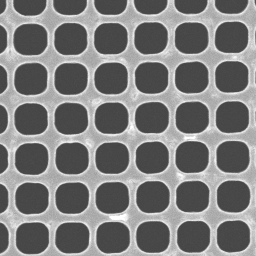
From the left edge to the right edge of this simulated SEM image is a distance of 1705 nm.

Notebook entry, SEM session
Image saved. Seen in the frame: a regular array of holes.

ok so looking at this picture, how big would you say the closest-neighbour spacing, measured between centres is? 39.6 px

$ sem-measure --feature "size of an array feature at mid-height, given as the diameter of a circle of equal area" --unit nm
228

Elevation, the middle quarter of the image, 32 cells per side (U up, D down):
DDDDDUUUUDDDDDDUUUUDDDDDDUUUUDDD
DDDDDDUUDDDDDDDDUUDDDDDDDDUUDDDD
DDDDDDUUDDDDDDDDUUDDDDDDDDUUDDDD
DDDDDDUUDDDDDDDDUUDDDDDDDDUUDDDD
DDDDDDUUDDDDDDDDUUDDDDDDDDUUDDDD
DDDDDDUUDDDDDDDDUUDDDDDDDDUUDDDD
DDDDDUUUDDDDDDDUUUUDDDDDDUUUUDDD
DDDUUUUUUUDDDDUUUUUUUDDUUUUUUUUU
UUUUUUUUUUUUUUUUUUUUUUUUUUUUUUUU
UUUUUUUUUUUDDUUUUUUUUUDUUUUUUUDD
DDDDDUUUUDDDDDDUUUUDDDDDDUUUUDDD
DDDDDDUUDDDDDDDDUUDDDDDDDDUUDDDD
DDDDDDUUDDDDDDDDUUDDDDDDDDUUDDDD
DDDDDDUUDDDDDDDDUUDDDDDDDDUUDDDD
DDDDDDUUDDDDDDDDUUDDDDDDDDUUDDDD
DDDDDDUUDDDDDDDDUUDDDDDDDDUUDDDD
DDDDDUUUDDDDDDDUUUUDDDDDDUUUUDDD
DDDUUUUUUUDDDUUUUUUUDDDUUUUUUUUU
UUUUUUUUUUUUUUUUUUUUUUUUUUUUUUUU
UUUUUUUUUUUDDUUUUUUUUDDDUUUUUUDD
DDDDDUUUUDDDDDDUUUUDDDDDDDUUUDDD
DDDDDDUUDDDDDDDDUUDDDDDDDDUUDDDD
DDDDDDUUDDDDDDDDUUDDDDDDDDUUDDDD
DDDDDDUUDDDDDDDDUUDDDDDDDDUUDDDD
DDDDDDUUDDDDDDDDUUDDDDDDDDUUDDDD
DDDDDDUUDDDDDDDDUUDDDDDDDDUUDDDD
DDDDDUUUUDDDDDDUUUUDDDDDDUUUUDDD
DDDDUUUUUUUDDUUUUUUUUDUUUUUUUUUU
UUUUUUUUUUUUUUUUUUUUUUUUUUUUUUUU
UUUUUUUUUUDDDDUUUUUUDDDDUUUUUUDD
DDDDDUUUUDDDDDDUUUUDDDDDDDUUUDDD
DDDDDDUUDDDDDDDDUUDDDDDDDDUUDDDD